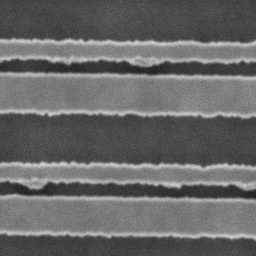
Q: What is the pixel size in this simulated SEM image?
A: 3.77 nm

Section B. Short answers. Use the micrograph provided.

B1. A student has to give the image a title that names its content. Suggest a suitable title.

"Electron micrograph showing lines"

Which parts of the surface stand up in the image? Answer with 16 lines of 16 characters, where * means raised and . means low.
................
................
..*.............
****************
****************
****************
****************
................
................
................
****************
****************
****************
****************
****************
................